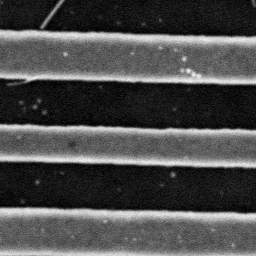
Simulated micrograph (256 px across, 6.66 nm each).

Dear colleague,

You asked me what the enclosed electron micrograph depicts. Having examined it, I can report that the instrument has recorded lines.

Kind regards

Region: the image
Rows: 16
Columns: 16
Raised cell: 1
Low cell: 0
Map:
0000000000000000
0000000000000000
1111111111111111
1111111111111111
1111111111111111
0000000000000000
0000000000000000
0000000000000000
1111111111111111
1111111111111111
0000000000000000
0000000000000000
0000000000000000
1111111111111111
1111111111111111
1111111111111111